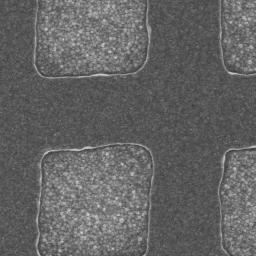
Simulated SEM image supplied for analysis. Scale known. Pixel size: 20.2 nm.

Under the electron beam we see holes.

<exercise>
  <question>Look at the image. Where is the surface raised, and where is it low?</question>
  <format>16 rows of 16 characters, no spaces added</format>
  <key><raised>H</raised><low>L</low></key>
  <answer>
HHLLLLLLLHHHHHLL
HHLLLLLLLHHHHHLL
HHLLLLLLLHHHHHLL
HHLLLLLLLHHHHHLL
HHHLLLLLHHHHHHLL
HHHHHHHHHHHHHHHH
HHHHHHHHHHHHHHHH
HHHHHHHHHHHHHHHH
HHHHHHHHHHHHHHHH
HHHLLLLLLHHHHHLL
HHHLLLLLLLHHHHLL
HHHLLLLLLHHHHHLL
HHHLLLLLLHHHHHLL
HHLLLLLLLHHHHHLL
HHLLLLLLLHHHHHLL
HHLLLLLLLHHHHHLL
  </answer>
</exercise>